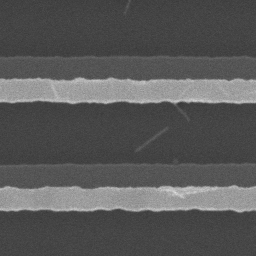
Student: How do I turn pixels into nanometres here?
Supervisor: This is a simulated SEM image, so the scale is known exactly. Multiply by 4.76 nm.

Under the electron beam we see lines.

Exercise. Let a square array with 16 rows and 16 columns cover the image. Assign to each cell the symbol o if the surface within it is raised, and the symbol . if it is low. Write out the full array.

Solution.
................
................
................
................
oooooooooooooooo
oooooooooooooooo
................
................
................
................
oooooooooooooooo
oooooooooooooooo
oooooooooooooooo
................
................
................